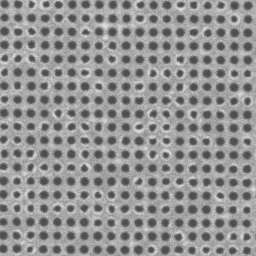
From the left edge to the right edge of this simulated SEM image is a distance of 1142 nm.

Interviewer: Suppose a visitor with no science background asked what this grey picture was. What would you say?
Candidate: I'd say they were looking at a regular array of holes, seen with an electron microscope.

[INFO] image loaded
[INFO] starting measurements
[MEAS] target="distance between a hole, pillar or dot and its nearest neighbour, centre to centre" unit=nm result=59.2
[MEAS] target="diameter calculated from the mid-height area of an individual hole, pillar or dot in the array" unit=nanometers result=39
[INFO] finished